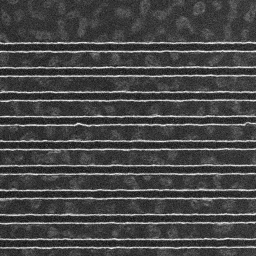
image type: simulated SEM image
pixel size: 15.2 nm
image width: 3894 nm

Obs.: parallel lines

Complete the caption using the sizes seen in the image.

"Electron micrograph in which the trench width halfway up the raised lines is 238 nm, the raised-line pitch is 373 nm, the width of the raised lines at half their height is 9.13 px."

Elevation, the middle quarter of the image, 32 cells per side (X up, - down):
--------------------------------
XXXXXXXXXXXXXXXXXXXXXXXXXXXXXXXX
XXXXXXXXXXXXXXXXXXXXXXXXXXXXXXXX
--------------------------------
--------------------------------
--------------------------------
--------------------------------
XXXXXXXXXXXXXXXXXXXXXXXXXXXXXXXX
XXXXXXXXXXXXXXXXXXXXXXXXXXXXXXXX
--------------------------------
--------------------------------
--------------------------------
--------------------------------
XXXXXXXXXXXXXXXXXXXXXXXXXXXXXXXX
XXXXXXXXXXXXXXXXXXXXXXXXXXXXXXXX
--------------------------------
--------------------------------
--------------------------------
--------------------------------
XXXXXXXXXXXXXXXXXXXXXXXXXXXXXXXX
XXXXXXXXXXXXXXXXXXXXXXXXXXXXXXXX
--------------------------------
--------------------------------
X-------------------------------
--------------------------------
XXXXXXXXXXXXXXXXXXXXXXXXXXXXXXXX
XXXXXXXXXXXXXXXXXXXXXXXXXXXXXXXX
XXXX-XX--XXXX--X-XX---------X--X
--------------------------------
--------------------------------
--------------------------------
-----------------------XXXXX----